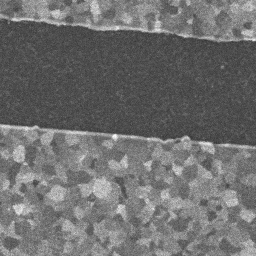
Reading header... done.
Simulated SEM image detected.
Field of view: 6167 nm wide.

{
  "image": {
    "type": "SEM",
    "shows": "one or a few lines or trenches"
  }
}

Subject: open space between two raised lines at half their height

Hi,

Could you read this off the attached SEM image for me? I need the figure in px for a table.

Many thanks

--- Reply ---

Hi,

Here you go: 107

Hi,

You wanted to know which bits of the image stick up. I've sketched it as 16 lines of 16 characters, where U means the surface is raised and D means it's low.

UUUUUUUUUUUUUUUU
DDDDUUUUUUUUUUUU
DDDDDDDDDDDDDDUD
DDDDDDDDDDDDDDDD
DDDDDDDDDDDDDDDD
DDDDDDDDDDDDDDDD
DDDDDDDDDDDDDDDD
DDDDDDDDDDDDDDDD
UUUUUUUDDDDDDDDD
UUUUUUUUUUUUUUUU
UUUUUUUUUUUUUUUU
UUUUUUUUUUUUUUUU
UUUUUUUUUUUUUUUU
UUUUUUUUUUUUUUUU
UUUUUUUUUUUUUUUU
UUUUUUUUUUUUUUUU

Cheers